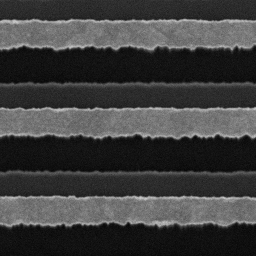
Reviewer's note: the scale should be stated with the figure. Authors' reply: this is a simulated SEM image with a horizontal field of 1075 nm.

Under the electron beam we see lines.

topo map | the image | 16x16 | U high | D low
UUUUUUUUUUUUUUUU
UUUUUUUUUUUUUUUU
UUUUUUUUUUUUUUUU
DDDDDDDDDDDDDDDD
DDDDDDDDDDDDDDDD
UUUUUUUUUUUUUUUU
UUUUUUUUUUUUUUUU
UUUUUUUUUUUUUUUU
DDDDDUUUDUUUUDUU
DDDDDDDDDDDDDDDD
DDDDDDDDDDDDDDDD
UUUUUUUUUUUUUUUU
UUUUUUUUUUUUUUUU
UUUUUUUUUUUUUUUU
DDDDDDDDDDDDDDDD
DDDDDDDDDDDDDDDD